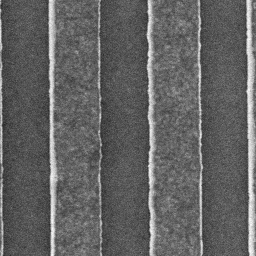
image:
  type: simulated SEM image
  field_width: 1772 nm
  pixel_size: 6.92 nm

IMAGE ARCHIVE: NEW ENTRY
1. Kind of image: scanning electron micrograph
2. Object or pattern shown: lines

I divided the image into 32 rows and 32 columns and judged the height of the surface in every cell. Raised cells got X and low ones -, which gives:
------XXXXXX-------XXXXXX------X
------XXXXXX-------XXXXXX------X
------XXXXXX-------XXXXXX------X
------XXXXXX-------XXXXXX------X
------XXXXXX-------XXXXXX------X
------XXXXXX-------XXXXXX------X
------XXXXXX-------XXXXXX------X
------XXXXXX-------XXXXXX------X
------XXXXXX-------XXXXXX------X
------XXXXXX-------XXXXXX------X
------XXXXXX-------XXXXXX------X
------XXXXXX-------XXXXXX------X
------XXXXXXX------XXXXXX------X
------XXXXXXX------XXXXXX------X
------XXXXXXX------XXXXXX------X
------XXXXXXX------XXXXXX------X
------XXXXXX-------XXXXXX------X
------XXXXXXX------XXXXXX------X
------XXXXXXX------XXXXXX------X
------XXXXXXX------XXXXXX------X
-------XXXXX-------XXXXXX------X
-------XXXXX-------XXXXXX------X
-------XXXXX-------XXXXXX------X
-------XXXXXX------XXXXXX------X
-------XXXXXX------XXXXXX------X
-------XXXXXX------XXXXXX------X
-------XXXXXX------XXXXXX------X
-------XXXXXX------XXXXXX------X
-------XXXXXX------XXXXXX------X
-------XXXXXX------XXXXXX------X
-------XXXXXX------XXXXXX------X
-------XXXXXX------XXXXXX------X